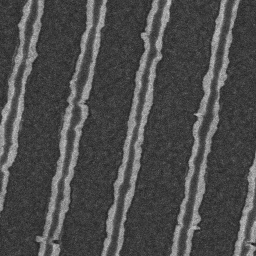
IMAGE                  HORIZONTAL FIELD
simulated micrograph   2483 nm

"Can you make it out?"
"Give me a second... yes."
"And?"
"parallel lines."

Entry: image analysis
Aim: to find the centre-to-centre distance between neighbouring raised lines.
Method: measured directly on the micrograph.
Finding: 0.622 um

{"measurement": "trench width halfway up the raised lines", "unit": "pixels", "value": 48.8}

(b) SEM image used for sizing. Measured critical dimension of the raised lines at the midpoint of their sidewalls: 133 nm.